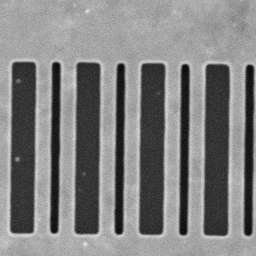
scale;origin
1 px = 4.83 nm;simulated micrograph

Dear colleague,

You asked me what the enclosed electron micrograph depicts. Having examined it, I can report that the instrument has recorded groups of lines, slits or small figures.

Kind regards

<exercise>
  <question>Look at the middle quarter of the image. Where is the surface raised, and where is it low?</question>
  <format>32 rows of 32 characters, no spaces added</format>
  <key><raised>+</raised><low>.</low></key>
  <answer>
+++......++++..++++......++++..+
+++......++++..++++......++++...
+++......++++..++++......++++...
+++......++++..++++......++++...
+++......++++..++++......++++...
+++......++++..++++......++++...
+++......++++..++++......++++...
+++......++++..++++......++++...
+++......++++..++++......++++...
+++......++++..++++......++++...
+++......++++..++++......++++...
+++......++++..++++......++++...
+++......++++..++++......++++...
+++......++++..++++......++++...
+++......++++..++++......++++...
+++......++++..++++......++++...
+++......++++..++++......++++..+
+++......++++..++++......++++..+
+++......++++..++++......++++..+
+++......++++..++++......++++..+
+++......++++..++++......++++..+
+++......++++..++++......++++..+
+++......++++..++++......++++..+
+++......++++..++++......++++..+
+++......++++..++++......++++..+
+++......++++..++++......++++..+
+++......++++..++++......++++..+
+++......++++..++++......++++..+
+++......++++..++++......++++..+
++.......++++..++++......++++..+
++.......++++..++++......++++..+
++.......++++..++++......++++..+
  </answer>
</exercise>